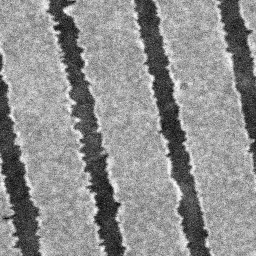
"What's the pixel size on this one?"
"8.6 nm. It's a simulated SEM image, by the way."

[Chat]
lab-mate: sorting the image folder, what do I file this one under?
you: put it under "one or a few lines or trenches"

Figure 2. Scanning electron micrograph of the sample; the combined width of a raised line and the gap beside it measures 0.702 um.